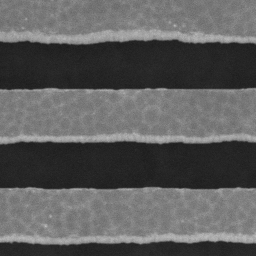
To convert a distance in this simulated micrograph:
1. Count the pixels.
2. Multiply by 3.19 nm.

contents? lines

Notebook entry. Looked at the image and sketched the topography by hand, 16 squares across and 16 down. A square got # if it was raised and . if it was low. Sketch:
################
################
..####......####
................
................
................
################
################
################
................
................
................
################
################
################
................